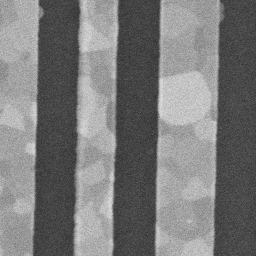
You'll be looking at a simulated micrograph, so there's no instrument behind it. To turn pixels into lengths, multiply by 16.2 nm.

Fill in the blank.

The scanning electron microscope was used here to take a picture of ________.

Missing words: lines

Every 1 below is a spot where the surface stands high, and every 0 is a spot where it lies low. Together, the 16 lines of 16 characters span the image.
1100011000111100
1100011000111100
1100011000111100
1100011000111100
1100011000111100
1100011000111100
1100011000111100
1100011000111100
1100011000111100
1100011000111000
1100011000111000
1100011000111000
1100011000111000
1100011000111000
1100011000111000
1100011000111000